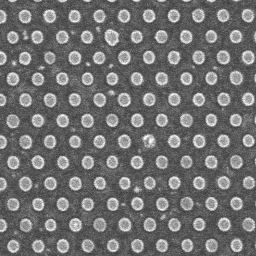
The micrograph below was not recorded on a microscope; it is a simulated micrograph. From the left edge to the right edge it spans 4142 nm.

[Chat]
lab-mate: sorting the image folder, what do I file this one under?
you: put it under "a regular array of raised bodies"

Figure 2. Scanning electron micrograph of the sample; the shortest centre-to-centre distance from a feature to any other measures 388 nm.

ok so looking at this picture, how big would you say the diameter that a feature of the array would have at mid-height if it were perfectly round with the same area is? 191 nanometers